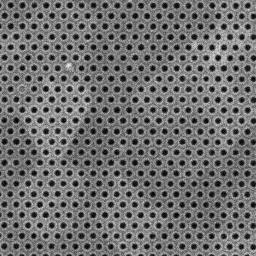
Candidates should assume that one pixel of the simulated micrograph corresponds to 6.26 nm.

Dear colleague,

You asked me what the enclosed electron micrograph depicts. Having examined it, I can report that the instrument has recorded a regular array of holes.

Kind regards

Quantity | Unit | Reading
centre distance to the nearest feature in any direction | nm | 71.8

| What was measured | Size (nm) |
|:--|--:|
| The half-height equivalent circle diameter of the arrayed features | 42.4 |